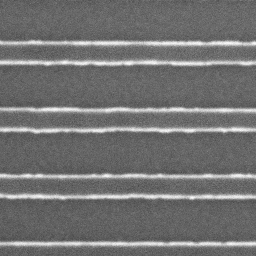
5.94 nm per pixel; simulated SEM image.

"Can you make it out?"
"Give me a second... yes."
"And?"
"lines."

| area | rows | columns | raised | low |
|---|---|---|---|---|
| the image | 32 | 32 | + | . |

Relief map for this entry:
................................
................................
................................
................................
................................
++++++++++++++++++++++++++++++++
++++++++++++++++++++++++++++++++
++++++++++++++++++++++++++++++++
................................
................................
................................
................................
................................
................................
++++++++++++++++++++++++++++++++
++++++++++++++++++++++++++++++++
....+...........................
................................
................................
................................
................................
................................
++++++++++++++++++++++++++++++++
++++++++++++++++++++++++++++++++
++++++++++++++++++++++++++++++++
................................
................................
................................
................................
................................
++++++++++++++++++++++++.+++++++
++++++++++++++++++++++++++++++++